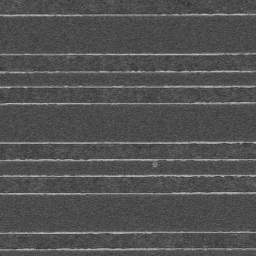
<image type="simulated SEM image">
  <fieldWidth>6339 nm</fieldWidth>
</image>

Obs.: lines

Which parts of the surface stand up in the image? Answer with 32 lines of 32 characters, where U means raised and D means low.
DDDDDDDDDDDDDDDDDDDDDDDDDDDDDDDD
DDDDDDDDDDDDDDDDDDDDDDDDDDDDDDDD
UUUUUUUUUUUUUUUUUUUUUUUUUUUUUUUU
UUUUUUUUUUUUUUUUUUUUUUUUUUUUUUUU
UUUUUUUUUUUUUUUUUUUUUUUUUUUUUUUU
UUUUUUUUUUUUUUUUUUUUUUUUUUUUUUUU
UUUUUUUUUUUUUUUUUUUUUUUUUUUUUUUU
DDDDDDDDDDDDDDDDDDDDDDDDDDDDDDDD
DDDDDDDDDDDDDDDDDDDDDDDDDDDDDDDD
UUUUUUUUUUUUUUUUUUUUUUUUUUUUUUUU
UUUUUUUUUUUUUUUUUUUUUUUUUUUUUUUU
DDDDDDDDDDDDDDDDDDDDDDDDDDDDDDDD
DDDDDDDDDDDDDDDDDDDDDDDDDDDDDDDD
UUUUUUUUUUUUUUUUUUUUUUUUUUUUUUUU
UUUUUUUUUUUUUUUUUUUUUUUUUUUUUUUU
UUUUUUUUUUUUUUUUUUUUUUUUUUUUUUUU
UUUUUUUUUUUUUUUUUUUUUUUUUUUUUUUU
UUUUUUUUUUUUUUUUUUUUUUUUUUUUUUUU
DDDDDDDDDDDDDDDDDDDDDDDDDDDDDDDD
DDDDDDDDDDDDDDDDDDDDDDDDDDDDDDDD
UUUUUUUUUUUUUUUUUUUUUUUUUUUUUUUU
UUUUUUUUUUUUUUUUUUUUUUUUUUUUUUUU
DDDDDDDDDDDDDDDDDDDDDDDDDDDDDDDD
DDDDDDDDDDDDDDDDDDDDDDDDDDDDDDDD
UUUUUUUUUUUUUUUUUUUUUUUUUUUUUUUU
UUUUUUUUUUUUUUUUUUUUUUUUUUUUUUUU
UUUUUUUUUUUUUUUUUUUUUUUUUUUUUUUU
UUUUUUUUUUUUUUUUUUUUUUUUUUUUUUUU
UUUUUUUUUUUUUUUUUUUUUUUUUUUUUUUU
DDDDDDDDDDDDDDDDDDDDDDDDDDDDDDDD
DDDDDDDDDDDDDDDDDDDDDDDDDDDDDDDD
UUUUUUUUUUUUUUUUUUUUUUUUUUUUUUUU